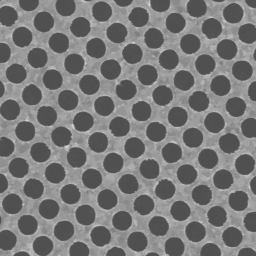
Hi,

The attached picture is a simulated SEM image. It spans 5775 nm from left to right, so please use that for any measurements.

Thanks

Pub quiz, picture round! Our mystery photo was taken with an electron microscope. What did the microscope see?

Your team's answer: a regular array of holes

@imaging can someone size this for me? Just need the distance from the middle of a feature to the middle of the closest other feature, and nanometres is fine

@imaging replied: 581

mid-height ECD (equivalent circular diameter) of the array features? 0.466 um